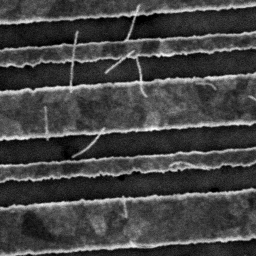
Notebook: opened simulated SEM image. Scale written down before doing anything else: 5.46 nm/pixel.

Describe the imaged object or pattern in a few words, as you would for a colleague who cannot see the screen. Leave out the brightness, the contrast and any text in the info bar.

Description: lines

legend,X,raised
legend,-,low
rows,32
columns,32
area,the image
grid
XXXXXXXXXXXXXXXXXXXXXXXXXXXXXXXX
XXXXXXXXXXXXXXXXXXXXXX----------
XXXXXXX-------------------------
--------------------------------
--------------------------XXXXXX
--------XXXXXXXXXXXXXXXXXXXXXXXX
XXXXXXXXXXXXXXXXXXXXXXXXXXX-----
XXXXXXXXXXXX--------------------
--------------------------------
----------------------------XXXX
-------------X--XXXXXXXXXXXXXXXX
XXXXXXXXXXXXXXXXXXXXXXXXXXXXXXXX
XXXXXXXXXXXXXXXXXXXXXXXXXXXXXXXX
XXXXXXXXXXXXXXXXXXXXXXXXXXXXXXXX
XXXXXXXXXXXXXXXXXXXXXXXXXXXXXXXX
XXXXXXXXXXXXXXXXXXXXXXXXXXXXXXXX
XXXXXXXXXXXXXX------------------
X-------------------------------
--------------------------------
-----------------XXXXXXXXXXXXXXX
----XXXXXXXXXXXXXXXXXXXXXXXXXXXX
XXXXXXXXXXXXXXXXX---------------
X-X-X---------------------------
--------------------------------
----------------------XXXXXXXXXX
------XXXXXXXXXXXXXXXXXXXXXXXXXX
XXXXXXXXXXXXXXXXXXXXXXXXXXXXXXXX
XXXXXXXXXXXXXXXXXXXXXXXXXXXXXXXX
XXXXXXXXXXXXXXXXXXXXXXXXXXXXXXXX
XXXXXXXXXXXXXXXXXXXXXXXXXXXXXXXX
XXXXXXXXXXXXXXXXXXXXX-----------
XXXXXXXX------------------------